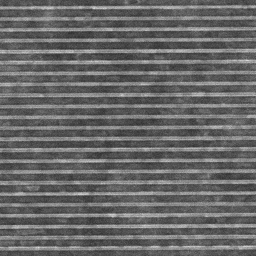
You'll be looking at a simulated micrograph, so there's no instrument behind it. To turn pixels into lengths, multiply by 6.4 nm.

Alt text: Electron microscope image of parallel lines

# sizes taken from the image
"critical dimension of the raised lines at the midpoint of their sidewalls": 17.6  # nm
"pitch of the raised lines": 70.1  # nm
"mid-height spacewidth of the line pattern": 52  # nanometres